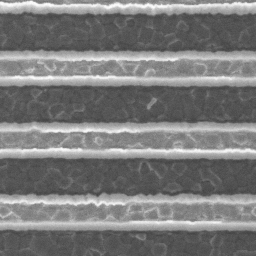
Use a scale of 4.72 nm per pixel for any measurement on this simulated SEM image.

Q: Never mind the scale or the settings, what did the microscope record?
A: one or a few lines or trenches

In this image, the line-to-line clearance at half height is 42.9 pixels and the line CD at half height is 136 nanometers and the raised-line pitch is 339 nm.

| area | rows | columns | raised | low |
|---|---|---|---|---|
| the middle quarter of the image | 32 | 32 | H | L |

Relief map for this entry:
HHHHHHHHHHHHHHHHHHHHHHHHHHHHHHHH
HHHHHHHHHHHHHHHHHHHHHHHHHHHHHHHH
HHHHHHHHHHHHHHHHHHHHHHHHHHHHHHHH
HHHHHHHHHHHHHHHHHHHHHHHHHHHHHHHH
LLHHHLLHHHHHHHHHHHHHHHLHHHHHHHHH
LLLLLLLLLLLLLLLLLLLLLLLLLLLLLLLL
LLLLLLLLLLLLLLLLLLLLLLLLLLLLLLLL
LLLLLLLLLLLLLLLLLLLLLLLLLLLLLLLL
LLLLLLLLLLLLLLLLLLLLLLLLLLLLLLLL
LLLLLLLLLLLLLLLLLLLLLLLLLLLLLLLL
LLLLLLLLLLLLLLLLLLLLLLLLLLLLLLLL
LLLLLLLLLLLLLLLLLLLLLLLLLLLLLLLL
LLLLLLLLLLLLLLLLLLLLLLLLLLLLLLLL
LLLLLLLLLLLLLLLLLLLLLLLLLLLLLLLL
LLLLLLLLLLLLLLLLLLLLLLLLLLLLLLLL
LLLLLLLLLLLLLLLLLLLLLLLLHHLLLLLL
HHHHHHHHHHHHHHHHHHHHHHHHHHHHHHHH
HHHHHHHHHHHHHHHHHHHHHHHHHHHHHHHH
HHHHHHHHHHHHHHHHHHHHHHHHHHHHHHHH
HHHHHHHHHHHHHHHHHHHHHHHHHHHHHHHH
HHHHHHHHHHHHHHHHHHHHHHHHHHHHHHHH
HHHHHHHHHHHHHHHHHHHHHHHHHHHHHHHH
HHHHHHHHHHHHHHHHHHHHHHHHHHHHHHHH
LLLLLLLLLLLLLLLLLLLLLLLLLLLLLLLL
LLLLLLLLLLLLLLLLLLLLLLLLLLLLLLLL
LLLLLLLLLLLLLLLLLLLLLLLLLLLLLLLL
LLLLLLLLLLLLLLLLLLLLLLLLLLLLLLLL
LLLLLLLLLLLLLLLLLLLLLLLLLLLLLLLL
LLLLLLLLLLLLLLLLLLLLLLLLLLLLLLLL
LLLLLLLLLLLLLLLLLLLLLLLLLLLLLLLL
LLLLLLLLLLLLLLLLLLLLLLLLLLLLLLLL
LLLLLLLLLLLLLLLLLLLLLLLLLLLLLLLL